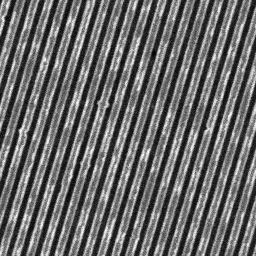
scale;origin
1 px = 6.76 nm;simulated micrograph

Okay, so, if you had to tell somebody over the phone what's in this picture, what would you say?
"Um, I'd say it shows parallel lines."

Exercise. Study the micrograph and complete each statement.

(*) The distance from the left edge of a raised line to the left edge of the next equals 91.8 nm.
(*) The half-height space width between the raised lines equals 42.1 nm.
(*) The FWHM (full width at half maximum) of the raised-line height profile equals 47.8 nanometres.